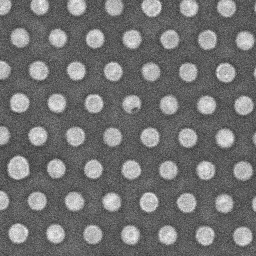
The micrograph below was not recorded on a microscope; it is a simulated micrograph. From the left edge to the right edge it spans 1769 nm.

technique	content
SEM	a regular array of raised bodies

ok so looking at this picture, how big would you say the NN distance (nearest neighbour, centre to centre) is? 256 nanometers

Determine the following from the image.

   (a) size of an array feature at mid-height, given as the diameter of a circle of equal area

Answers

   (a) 0.125 microns